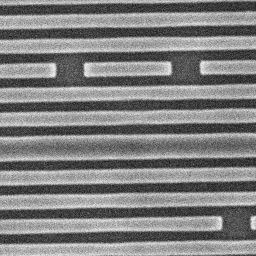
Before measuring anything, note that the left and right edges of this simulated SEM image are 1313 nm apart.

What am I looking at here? groups of lines, slits or small figures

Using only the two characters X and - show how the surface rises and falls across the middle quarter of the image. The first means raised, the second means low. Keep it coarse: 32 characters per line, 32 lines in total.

-----XXXXXXXXXXXXXXXXXXXXXX-----
-----XXXXXXXXXXXXXXXXXXXXXX-----
-----XXXXXXXXXXXXXXXXXXXXXX-----
--------------------------------
--------------------------------
--------------------------------
XXXXXXXXXXXXXXXXXXXXXXXXXXXXXXXX
XXXXXXXXXXXXXXXXXXXXXXXXXXXXXXXX
XXXXXXXXXXXXXXXXXXXXXXXXXXXXXXXX
--------------------------------
--------------------------------
--------------------------------
XXXXXXXXXXXXXXXXXXXXXXXXXXXXXXXX
XXXXXXXXXXXXXXXXXXXXXXXXXXXXXXXX
XXXXXXXXXXXXXXXXXXXXXXXXXXXXXX--
--------------------------------
--------------------------------
--------------------------------
XXXXXXXXXXXXXXXXXXXXXXXXXXXXXXXX
XXXXXXXXXXXXXXXXXXXXXXXXXXXXXXXX
XXXXXXXXXXXXXXXXXXXXXXXXXXXXXXXX
XXXXXXXXXXXXXXXXXXXXXXXXXXXXXXXX
XXXXXXXXXXXXXXXXXXXXXXXXXXXXXXXX
XXXXXXXXXXXXXXXXXXX-------------
--------------------------------
--------------------------------
------------XXXXXXXXXXXXXXXXXXXX
XXXXXXXXXXXXXXXXXXXXXXXXXXXXXXXX
XXXXXXXXXXXXXXXXXXXXXXXXXXXXXXXX
XXXXXXXXXXXXXXXXXXXX------------
--------------------------------
--------------------------------